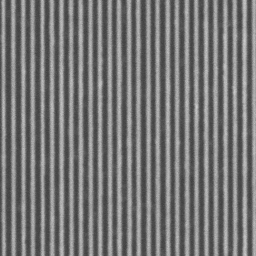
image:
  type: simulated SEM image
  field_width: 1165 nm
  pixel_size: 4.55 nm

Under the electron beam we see parallel lines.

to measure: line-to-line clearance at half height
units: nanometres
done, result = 30.7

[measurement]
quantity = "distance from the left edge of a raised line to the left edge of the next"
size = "43.9 nm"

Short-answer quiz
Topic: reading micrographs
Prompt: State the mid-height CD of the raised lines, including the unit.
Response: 0.0154 µm